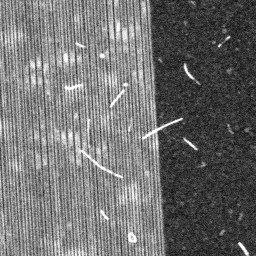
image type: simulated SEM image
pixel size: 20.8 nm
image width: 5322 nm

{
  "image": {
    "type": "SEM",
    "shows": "parallel lines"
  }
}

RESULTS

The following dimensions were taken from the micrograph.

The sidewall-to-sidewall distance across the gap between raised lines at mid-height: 33.7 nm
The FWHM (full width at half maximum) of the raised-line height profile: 101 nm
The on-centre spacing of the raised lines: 6.73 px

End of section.